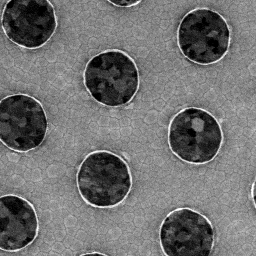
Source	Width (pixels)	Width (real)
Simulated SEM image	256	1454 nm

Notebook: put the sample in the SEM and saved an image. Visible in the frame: raised bodies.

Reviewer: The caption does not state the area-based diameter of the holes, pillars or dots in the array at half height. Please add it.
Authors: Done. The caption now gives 314 nanometres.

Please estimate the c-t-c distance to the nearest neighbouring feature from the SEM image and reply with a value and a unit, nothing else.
570 nm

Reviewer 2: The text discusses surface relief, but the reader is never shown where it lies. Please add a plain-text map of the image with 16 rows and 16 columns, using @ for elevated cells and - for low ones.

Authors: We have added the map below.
@@@-------------
@@@--------@@@--
-@@--------@@@--
------@@----@@--
-----@@@@-------
-----@@@@-------
@@----@@--------
@@@--------@@---
@@@--------@@@--
------@----@@@--
-----@@@--------
-----@@@--------
@@---@@@--------
@@---------@@---
@@--------@@@---
@---------@@@---